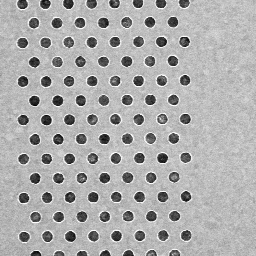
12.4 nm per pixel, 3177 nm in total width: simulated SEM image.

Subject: a regular array of holes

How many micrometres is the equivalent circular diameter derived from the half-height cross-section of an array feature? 0.139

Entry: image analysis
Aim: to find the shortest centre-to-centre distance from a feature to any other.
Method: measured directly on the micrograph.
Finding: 278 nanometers